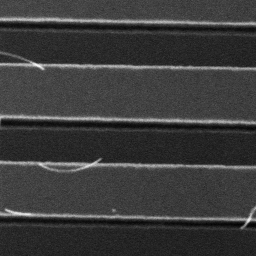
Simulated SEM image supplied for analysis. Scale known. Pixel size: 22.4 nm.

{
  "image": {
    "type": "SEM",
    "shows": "lines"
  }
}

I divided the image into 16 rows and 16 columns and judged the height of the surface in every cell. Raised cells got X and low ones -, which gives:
XXXXXXXXXXXXXXXX
--------------XX
----------------
----------------
XXXXXXXXXXXXXXXX
XXXXXXXXXXXXXXXX
XXXXXXXXXXXXXXXX
------XXXXXXXXXX
----------------
----------------
XXXXXXXXXXXXXXXX
XXXXXXXXXXXXXXXX
XXXXXXXXXXXXXXXX
-XXXXXXXXXXXXXXX
----------------
----------------